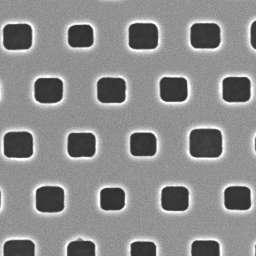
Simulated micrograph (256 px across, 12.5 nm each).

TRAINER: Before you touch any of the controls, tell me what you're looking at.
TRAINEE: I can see a regular array of holes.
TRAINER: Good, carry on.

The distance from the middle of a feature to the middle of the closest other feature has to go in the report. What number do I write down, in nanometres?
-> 775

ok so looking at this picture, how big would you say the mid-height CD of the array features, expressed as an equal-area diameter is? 372 nm